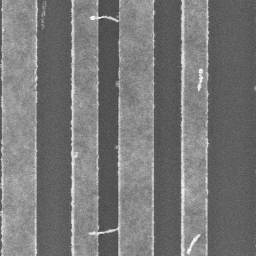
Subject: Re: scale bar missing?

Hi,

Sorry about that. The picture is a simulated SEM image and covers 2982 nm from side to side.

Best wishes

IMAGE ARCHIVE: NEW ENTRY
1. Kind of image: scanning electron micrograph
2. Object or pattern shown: lines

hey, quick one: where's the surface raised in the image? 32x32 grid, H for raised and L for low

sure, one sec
HHHHHLLLLHHHLLLHHHHLLLLHHHLLLLLL
HHHHHLLLLHHHLLLHHHHLLLLHHHLLLLLL
HHHHHLLLLHHHLLLHHHHLLLLHHHLLLLLL
HHHHHLLLLHHHLLLHHHHLLLLHHHLLLLLL
HHHHHLLLLHHHLLLHHHHLLLLHHHLLLLLL
HHHHHLLLLHHHLLLHHHHLLLLHHHLLLLLL
HHHHHLLLLHHHLLLHHHHLLLLHHHLLLLLL
HHHHHLLLLHHHLLLHHHHLLLLHHHLLLLLL
HHHHHLLLLHHHLLLHHHHLLLLHHHLLLLLL
HHHHHLLLLHHHLLLHHHHLLLLHHHLLLLLL
HHHHLLLLLHHHLLLHHHHLLLLHHHLLLLLL
HHHHLLLLLHHHLLLHHHHLLLLHHHLLLLLL
HHHHLLLLLHHHLLLHHHHLLLLHHHLLLLLL
HHHHLLLLLHHHLLLHHHHLLLLHHHLLLLLL
HHHHLLLLLHHHLLLHHHHLLLLHHHLLLLLL
HHHHLLLLLHHHLLLHHHHLLLLHHHLLLLLL
HHHHLLLLLHHHLLLHHHHLLLLHHHLLLLLL
HHHHLLLLLHHHLLLHHHHLLLLHHHLLLLLL
HHHHLLLLLHHHLLLHHHHLLLLHHHLLLLLL
HHHHLLLLLHHHLLLHHHHLLLLHHHLLLLLL
HHHHLLLLLHHHLLLHHHHLLLLHHHLLLLLL
HHHHLLLLLHHHLLLHHHHLLLLHHHLLLLLL
HHHHLLLLLHHHLLLHHHHLLLLHHHLLLLLL
HHHHLLLLLHHHLLLHHHHLLLLHHHLLLLLL
HHHHLLLLLHHHLLLHHHHLLLLHHHLLLLLL
HHHHLLLLLHHHLLLHHHHLLLLHHHLLLLLL
HHHHLLLLLHHHLLLHHHHLLLLHHHLLLLLL
HHHHLLLLLHHHLLLHHHHLLLLHHHLLLLLL
HHHHLLLLLHHHLLLHHHHLLLLHHHLLLLLL
HHHHLLLLLHHHLLLHHHHLLLLHHHLLLLLL
HHHHLLLLLHHHLLLHHHHLLLLHHHLLLLLL
HHHHLLLLLHHHLLLHHHHLLLLHHHLLLLLL